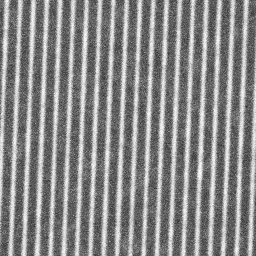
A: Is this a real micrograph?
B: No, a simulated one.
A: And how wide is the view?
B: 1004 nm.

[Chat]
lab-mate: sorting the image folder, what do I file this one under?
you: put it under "parallel lines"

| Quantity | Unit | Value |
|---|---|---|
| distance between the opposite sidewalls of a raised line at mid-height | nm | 11.8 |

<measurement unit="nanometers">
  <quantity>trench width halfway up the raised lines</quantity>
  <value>40.7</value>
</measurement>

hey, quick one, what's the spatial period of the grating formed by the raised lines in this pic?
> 13.3 px